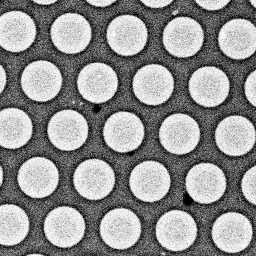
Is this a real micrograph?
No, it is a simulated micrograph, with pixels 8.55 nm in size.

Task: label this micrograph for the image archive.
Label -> an array of small figures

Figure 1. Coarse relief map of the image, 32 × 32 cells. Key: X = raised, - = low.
-----------XXX----XXX----XXX----
-X------------------------------
XXXX---XXXX---XXX-----XX-----XX-
XXXX--XXXXX---XXXX---XXXX---XXXX
XXXX--XXXXX--XXXXX--XXXXX--XXXXX
XXXX---XXXX---XXXX---XXXX--XXXXX
--------XX-----XX----XXXX---XXXX
--------------------------------
---XXXX----XXX----XXX----XX-----
X--XXXXX--XXXXX--XXXX---XXXX---X
X--XXXXX--XXXXX--XXXXX--XXXXX--X
---XXXX---XXXX---XXXX---XXXX---X
----XX-----XX-----XXX---XXXX---X
--------------------------------
XXX----XXX----XXX----XX---------
XXXX--XXXXX--XXXXX--XXXXX--XXXX-
XXXX--XXXXX--XXXXX--XXXXX--XXXXX
XXX---XXXXX--XXXXX--XXXXX--XXXXX
-X-----XXX----XXX----XXX---XXXX-
--------------------------------
---XXXX---XXX-----XX-----X------
--XXXXX--XXXXX---XXXX---XXXX---X
--XXXXX--XXXXX--XXXXX--XXXXX--XX
---XXXX--XXXXX--XXXXX--XXXXX--XX
----XX----XXX----XXX----XXXX---X
--------------------------------
XXX---XXXX----XX-----XX---------
XXXX--XXXX---XXXX---XXXX---XXXX-
XXXX--XXXXX--XXXXX--XXXXX--XXXX-
XXX---XXXX---XXXX---XXXX---XXXX-
XX-----XX----XXXX---XXXX---XXXX-
----------------------------X---